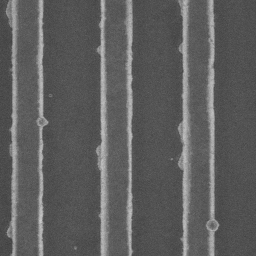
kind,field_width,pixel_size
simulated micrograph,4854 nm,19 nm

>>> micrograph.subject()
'lines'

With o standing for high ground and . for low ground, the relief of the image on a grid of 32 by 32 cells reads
..ooo........ooo.......ooo......
..ooo........ooo.......ooo......
..ooo........ooo.......ooo......
..ooo........ooo.......oooo.....
..ooo........ooo.......oooo.....
..ooo........ooo.......oooo.....
..ooo........ooo.......oooo.....
..ooo........ooo.......oooo.....
..ooo........ooo.......ooo......
..ooo........ooo.......oooo.....
..ooo........ooo.......ooo......
..ooo........ooo.......ooo......
..ooo........ooo.......ooo......
..ooo........ooo.......ooo......
..ooo........ooo.......oooo.....
..oooo.......ooo.......oooo.....
..ooo........ooo.......oooo.....
..ooo........ooo.......oooo.....
..ooo........ooo.......oooo.....
..ooo........ooo.......oooo.....
..ooo........ooo.......oooo.....
..ooo........ooo.......oooo.....
..ooo........ooo.......oooo.....
..ooo........ooo.......oooo.....
..ooo........ooo.......oooo.....
..ooo........ooo.......oooo.....
..ooo........ooo.......oooo.....
..ooo........ooo.......oooo.....
..ooo........ooo.......oooo.....
..ooo........ooo.......oooo.....
..ooo........ooo.......oooo.....
..ooo........ooo.......oooo.....